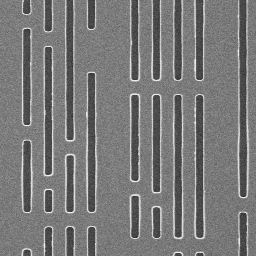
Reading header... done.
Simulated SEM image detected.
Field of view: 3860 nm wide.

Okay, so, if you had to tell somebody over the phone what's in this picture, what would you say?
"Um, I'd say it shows groups of lines, slits or small figures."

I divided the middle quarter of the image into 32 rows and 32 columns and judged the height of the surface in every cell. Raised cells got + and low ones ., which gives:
...++++++++++++++..+++..+++...++
...++++++++++++++..+++..+++...++
...+++..+++++++++..+++..+++...++
...+++..+++++++++..+++..++++.+++
...+++..++++++++++++++++++++++++
...+++..++++++++++++++++++++++++
...+++..++++++++++++++++++++++++
...+++..++++++++++++++++++++++++
...+++..+++++++++..+++..++++.+++
...+++..+++++++++..+++..+++...++
...+++..+++++++++..+++..+++...++
...+++..+++++++++..+++..+++...++
...+++..+++++++++..+++..+++...++
...+++..+++++++++..+++..+++...++
...+++..+++++++++..+++..+++...++
...+++..+++++++++..+++..+++...++
...+++..+++++++++..+++..+++...++
...+++..+++++++++..+++..+++...++
...+++..+++++++++..+++..+++...++
++++++..+++++++++..+++..+++...++
++++++..+++++++++..+++..+++...++
++++++..+++++++++..+++..++++..++
++++++..+++++++++..+++..++++..++
...+++..+++++++++..+++..+++...++
...+++..+++++++++..+++..+++...++
...+++..+++++++++..+++..++++..++
...+++..+++++++++..+++..++++..++
...+++..+++++++++..+++..++++..++
...+++..+++++++++..+++..+++...++
...+++..++++++++++++++..+++...++
...+++..++++++++++++++..+++...++
...+++..++++++++++++++..+++...++